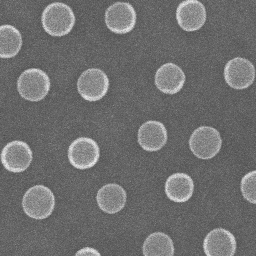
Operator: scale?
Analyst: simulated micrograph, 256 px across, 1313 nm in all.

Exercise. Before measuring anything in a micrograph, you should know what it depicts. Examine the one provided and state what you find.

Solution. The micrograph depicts a regular array of raised bodies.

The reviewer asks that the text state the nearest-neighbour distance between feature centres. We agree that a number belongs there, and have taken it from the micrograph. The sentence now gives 275 nm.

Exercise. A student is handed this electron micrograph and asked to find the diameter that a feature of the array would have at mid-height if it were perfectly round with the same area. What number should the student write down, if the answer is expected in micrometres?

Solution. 0.157